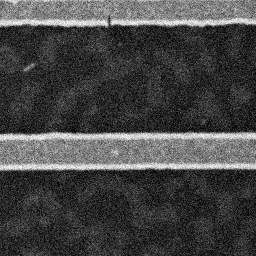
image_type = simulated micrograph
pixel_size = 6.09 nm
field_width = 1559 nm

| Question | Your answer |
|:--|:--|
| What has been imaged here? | one or a few lines or trenches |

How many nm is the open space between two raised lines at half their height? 689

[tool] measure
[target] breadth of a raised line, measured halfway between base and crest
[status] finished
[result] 187 nanometres